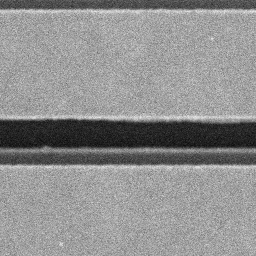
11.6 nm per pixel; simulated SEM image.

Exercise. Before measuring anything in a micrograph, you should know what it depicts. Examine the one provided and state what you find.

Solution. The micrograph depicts lines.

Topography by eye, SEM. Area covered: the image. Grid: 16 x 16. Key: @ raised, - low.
----------------
@@@@@@@@@@@@@@@@
@@@@@@@@@@@@@@@@
@@@@@@@@@@@@@@@@
@@@@@@@@@@@@@@@@
@@@@@@@@@@@@@@@@
@@@@@@@@@@@@@@@@
----------------
----------------
----------------
@@@@@@@@@@@@@@@@
@@@@@@@@@@@@@@@@
@@@@@@@@@@@@@@@@
@@@@@@@@@@@@@@@@
@@@@@@@@@@@@@@@@
@@@@@@@@@@@@@@@@